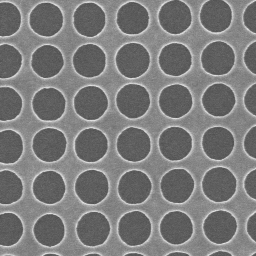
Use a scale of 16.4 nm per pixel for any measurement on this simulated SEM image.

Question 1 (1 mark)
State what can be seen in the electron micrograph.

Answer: a regular array of holes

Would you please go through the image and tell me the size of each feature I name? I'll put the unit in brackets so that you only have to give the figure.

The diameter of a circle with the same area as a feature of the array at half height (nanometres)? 560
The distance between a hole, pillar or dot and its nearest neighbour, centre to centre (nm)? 681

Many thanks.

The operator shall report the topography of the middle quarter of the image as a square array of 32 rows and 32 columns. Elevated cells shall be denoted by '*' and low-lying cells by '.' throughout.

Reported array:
**........***........***........
***.......***........***.......*
****.....*****......*****.....**
******.*********..**************
********************************
******..*******.....******....**
****.....*****.......****......*
***.......***........***........
***........**.........**........
.*.........**.........**........
.*.........**........***........
***.......****.......***.......*
***.......****......*****......*
*****....*******...********..***
********************************
********************************
*****....******.....*****.....**
****......****.......***.......*
***........**........***........
.**........**.........**........
.**........**.........**........
***........**.........**........
***.......****.......****......*
****......*****.....*****.....**
*****...*********.**************
********************************
******..**********.********...**
****......*****.....*****......*
***........***.......****.......
***........***........**........
***........***........**........
***........**.........**........